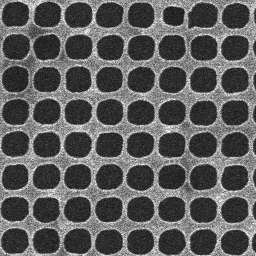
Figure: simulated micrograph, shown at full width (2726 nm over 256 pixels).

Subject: a regular array of holes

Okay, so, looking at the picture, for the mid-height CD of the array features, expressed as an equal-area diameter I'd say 291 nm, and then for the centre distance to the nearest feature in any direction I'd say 333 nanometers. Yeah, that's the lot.